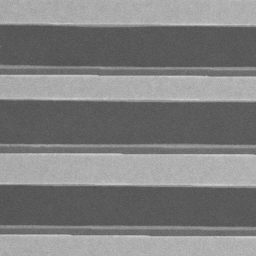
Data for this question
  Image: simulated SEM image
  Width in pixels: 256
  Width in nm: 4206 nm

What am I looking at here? lines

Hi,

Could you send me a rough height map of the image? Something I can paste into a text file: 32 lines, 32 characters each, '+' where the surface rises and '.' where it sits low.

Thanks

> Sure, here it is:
++++++++++++++++++++++++++++++++
++++++++++++++++++++++++++++++++
++++++++++++++++++++++++++++++++
................................
................................
................................
................................
................................
+++++++++++++...................
++++++++++++++++++++++++++++++++
++++++++++++++++++++++++++++++++
++++++++++++++++++++++++++++++++
................................
................................
................................
................................
................................
................................
++++++++++++++++++++++++++++++++
++++++++++++++++++++++++++++++++
++++++++++++++++++++++++++++++++
++++++++++++++++++++++++++++++++
++++++++++++++++++++++++++++++++
................................
................................
................................
................................
................................
+++++++++++++...................
++++++++++++++++++++++++++++++++
++++++++++++++++++++++++++++++++
++++++++++++++++++++++++++++++++